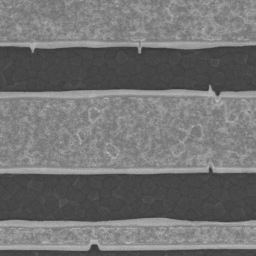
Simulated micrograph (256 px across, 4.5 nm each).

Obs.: one or a few lines or trenches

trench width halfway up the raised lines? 224 nm